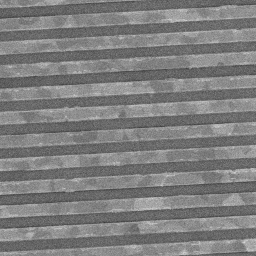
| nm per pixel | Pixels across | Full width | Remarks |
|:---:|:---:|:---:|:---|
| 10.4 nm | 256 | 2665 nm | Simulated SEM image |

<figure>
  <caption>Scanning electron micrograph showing parallel lines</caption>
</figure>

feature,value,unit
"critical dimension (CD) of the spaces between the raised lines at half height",120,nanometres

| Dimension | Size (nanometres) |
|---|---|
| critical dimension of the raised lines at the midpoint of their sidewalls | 129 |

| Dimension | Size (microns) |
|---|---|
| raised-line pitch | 0.243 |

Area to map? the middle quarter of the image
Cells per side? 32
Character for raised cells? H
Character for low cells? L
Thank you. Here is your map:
HHHHHHHHHHHHHHHHHHHHHHHHHHHHHHHH
HHHHHHHHHHHHHHHHHHHLLLLLLLLLLLLL
HLLLLLLLLLLLLLLLLLLLLLLLLLLLLLLL
LLLLLLLLLLLLLLLLLLLLLLLLLLLLLLLL
LLLLLLLLLLLLLLLLLHHHHHHHHHHHHHHH
HHHHHHHHHHHHHHHHHHHHHHHHHHHHHHHH
HHHHHHHHHHHHHHHHHHHHHHHHHHHHHHHH
HHHHHHHHHHHHHHHLLLLLLLLLLLLLLLLL
LLLLLLLLLLLLLLLLLLLLLLLLLLLLLLLL
LLLLLLLLLLLLLLLLLLLLLLLLLLLLLLLL
LLLLLLLLLLLLLLLLHHHHHHHHHHHHHHHH
HHHHHHHHHHHHHHHHHHHHHHHHHHHHHHHH
HHHHHHHHHHHHHHHHHHHHHHHHHHHHHHHL
HHHHHHHHHHLLLLLLLLLLLLLLLLLLLLLL
LLLLLLLLLLLLLLLLLLLLLLLLLLLLLLLL
LLLLLLLLLLLLLLLLLLLLLLLLLLLLLLLH
LLLLLLLLLLLLLLHHHHHHHHHHHHHHHHHH
HHHHHHHHHHHHHHHHHHHHHHHHHHHHHHHH
HHHHHHHHHHHHHHHHHHHHHHHHHHHHHLLL
HHHHHHHHHHLLLLLLLLLLLLLLLLLLLLLL
LLLLLLLLLLLLLLLLLLLLLLLLLLLLLLLL
LLLLLLLLLLLLLLLLLLLLLLLLLLLLLLHH
LLLLLLLLLLLLHHHHHHHHHHHHHHHHHHHH
HHHHHHHHHHHHHHHHHHHHHHHHHHHHHHHH
HHHHHHHHHHHHHHHHHHHHHHHHLLLLLLLL
HHHHHHLLLLLLLLLLLLLLLLLLLLLLLLLL
LLLLLLLLLLLLLLLLLLLLLLLLLLLLLLLL
LLLLLLLLLLLLLLLLLLLLLLLLHHHHHHHH
LLLLLLLLHHHHHHHHHHHHHHHHHHHHHHHH
HHHHHHHHHHHHHHHHHHHHHHHHHHHHHHHH
HHHHHHHHHHHHHHHHHHHHHHLLLLLLLLLL
HHHLLLLLLLLLLLLLLLLLLLLLLLLLLLLL